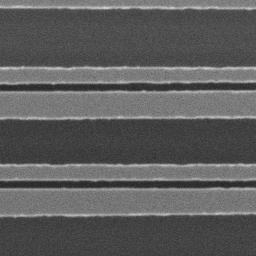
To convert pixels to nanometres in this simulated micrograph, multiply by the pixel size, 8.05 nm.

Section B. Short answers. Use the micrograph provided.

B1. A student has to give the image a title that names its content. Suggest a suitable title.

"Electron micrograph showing lines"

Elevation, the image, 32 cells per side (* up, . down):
********************************
................................
................................
................................
................................
................................
................................
................................
******.*.*****************..****
********************************
********************************
********************************
********************************
********************************
********************************
................................
................................
................................
................................
................................
................................
********************************
********************************
********************************
********************************
********************************
********************************
................................
................................
................................
................................
................................